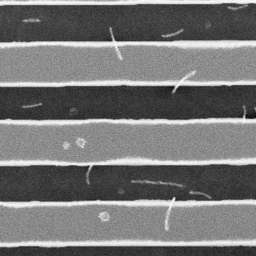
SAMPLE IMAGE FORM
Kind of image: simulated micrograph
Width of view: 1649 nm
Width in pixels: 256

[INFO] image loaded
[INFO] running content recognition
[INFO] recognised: lines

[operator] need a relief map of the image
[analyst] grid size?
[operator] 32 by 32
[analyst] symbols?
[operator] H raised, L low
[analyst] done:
HHHHHLHHHHHLHHHLLLLLLLLLLLLLLLLL
LLLLLLLLLLLLLLLLLLLLLLLLLLLLLLLL
LLLLLLLLLLLLLLLLLLLLLLLLLLLLLLLL
LLLLLLLLLLLLLLLLLLLLLLLLLLLLLLLL
LLLLLLLLLLLLLLLLLLLLLLLLLLLLLLLL
HHHHHHHHHHHHHHHHHHHHHHHHHHHHHHHH
HHHHHHHHHHHHHHHHHHHHHHHHHHHHHHHH
HHHHHHHHHHHHHHHHHHHHHHHHHHHHHHHH
HHHHHHHHHHHHHHHHHHHHHHHHHHHHHHHH
HHHHHHHHHHHHHHHHHHHHHHHHHHHHHHHH
HHHHHHHHHHHHHHHHHHHHHHHHHHHHHHHH
LLLLLLLLLLLLLLLLLLLLLLLLLLLLLLLL
LLLLLLLLLLLLLLLLLLLLLLLLLLLLLLLL
LLLLLLLLLLLLLLLLLLLLLLLLLLLLLLLL
LLLLLLLLLLLLLLLLLLLLLLLLLLLLLLLL
HHHHHHHHHHHHHHHHHHHHHHHHHHHHHHHH
HHHHHHHHHHHHHHHHHHHHHHHHHHHHHHHH
HHHHHHHHHHHHHHHHHHHHHHHHHHHHHHHH
HHHHHHHHHHHHHHHHHHHHHHHHHHHHHHHH
HHHHHHHHHHHHHHHHHHHHHHHHHHHHHHHH
HHHHHHHHHHHHHHLLLLLLLHHHHLLLLLLL
LLLLLLLLLLLLLLLLLLLLLLLLLLLLLLLL
LLLLLLLLLLLLLLLLLLLLLLLLLLLLLLLL
LLLLLLLLLLLLLLLLLLLLLLLLLLLLLLLL
LLLLLLLLLLLLLLLLLLLLLLLLLLLLLLLL
HHHHHHHHHHHHHHHHHHHHHHHHHHHHHHHH
HHHHHHHHHHHHHHHHHHHHHHHHHHHHHHHH
HHHHHHHHHHHHHHHHHHHHHHHHHHHHHHHH
HHHHHHHHHHHHHHHHHHHHHHHHHHHHHHHH
HHHHHHHHHHHHHHHHHHHHHHHHHHHHHHHH
HHHHHHHHHHHHHHHHHHHHHHHHHHHHHHHH
LLLLLLLLLLLLLLLLLLLLLLLLLLLLLLLL